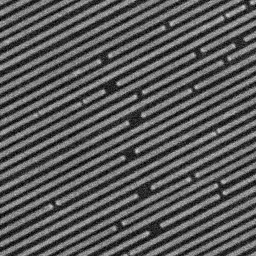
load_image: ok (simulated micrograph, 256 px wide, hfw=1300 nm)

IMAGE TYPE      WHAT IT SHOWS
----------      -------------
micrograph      parallel lines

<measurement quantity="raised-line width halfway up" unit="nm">19.7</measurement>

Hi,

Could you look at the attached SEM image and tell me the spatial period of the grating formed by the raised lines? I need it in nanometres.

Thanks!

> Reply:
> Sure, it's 49.5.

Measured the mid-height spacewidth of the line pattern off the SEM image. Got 28.7 nm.